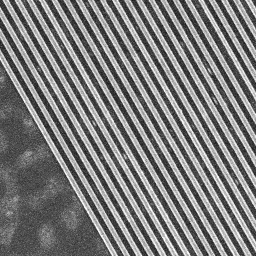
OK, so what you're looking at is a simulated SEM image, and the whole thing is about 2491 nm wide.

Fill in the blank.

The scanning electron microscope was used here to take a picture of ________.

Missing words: parallel lines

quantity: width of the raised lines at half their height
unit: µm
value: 0.0423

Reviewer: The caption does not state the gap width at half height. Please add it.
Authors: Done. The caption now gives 59.1 nm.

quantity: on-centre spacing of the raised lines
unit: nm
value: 103